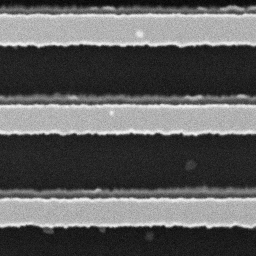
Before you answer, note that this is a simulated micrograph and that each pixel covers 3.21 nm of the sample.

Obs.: lines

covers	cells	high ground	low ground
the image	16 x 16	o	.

......o.......oo
oooooooooooooooo
oooooooooooooooo
................
................
................
oooooooooooooooo
oooooooooooooooo
................
................
................
................
oooooooooooooooo
oooooooooooooooo
................
................